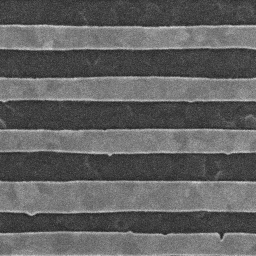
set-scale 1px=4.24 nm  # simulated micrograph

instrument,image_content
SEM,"parallel lines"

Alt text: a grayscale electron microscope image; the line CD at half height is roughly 0.0996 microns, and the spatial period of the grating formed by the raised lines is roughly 53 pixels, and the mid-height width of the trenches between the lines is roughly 120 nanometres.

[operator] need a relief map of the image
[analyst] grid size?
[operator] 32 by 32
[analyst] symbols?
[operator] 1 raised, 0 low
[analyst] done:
00000000000000000000000000000000
00000000000000000000000000000000
00000000000000000000000000000000
11111111111111111111111111111111
11111111111111111111111111111111
11111111111111111111111111111111
00000000000000000000000000000000
00000000000000000000000000000000
00000000000000000000000000000000
00000000000000000000000000000000
11111111111111111111111111111111
11111111111111111111111111111111
10000000000010111111111111111111
00000000000000000000000000000000
00000000000000000000000000000000
00000000000000000000000000000000
11111111111111111111111111111111
11111111111111111111111111111111
11111111111111111111111111111111
00000000000000000000000000000000
00000000000000000000000000000000
00000000000000000000000000000000
00000000000000000000000000000000
11111111111111111111111111111111
11111111111111111111111111111111
11111111111111111111111111111111
01111111111110000000000000000000
00000000000000000000000000000000
00000000000000000000000000000000
11111111111111111111111111101111
11111111111111111111111111111111
11111111111111111111111111111111